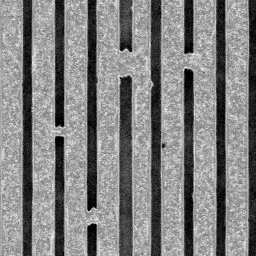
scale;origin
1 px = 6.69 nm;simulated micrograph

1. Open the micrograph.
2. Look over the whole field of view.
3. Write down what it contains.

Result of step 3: parallel lines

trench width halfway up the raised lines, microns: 0.0652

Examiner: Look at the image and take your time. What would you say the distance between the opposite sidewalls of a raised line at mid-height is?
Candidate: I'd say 0.149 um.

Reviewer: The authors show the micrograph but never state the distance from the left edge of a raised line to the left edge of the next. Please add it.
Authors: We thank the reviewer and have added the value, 0.216 µm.